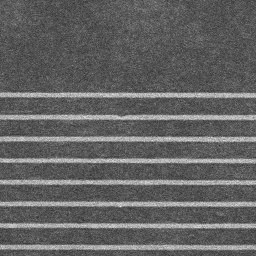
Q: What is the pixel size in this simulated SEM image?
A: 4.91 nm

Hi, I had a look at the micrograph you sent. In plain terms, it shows parallel lines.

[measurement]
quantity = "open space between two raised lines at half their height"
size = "85.9 nm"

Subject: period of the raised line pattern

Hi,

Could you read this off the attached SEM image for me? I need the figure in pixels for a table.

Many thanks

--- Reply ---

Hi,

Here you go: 21.7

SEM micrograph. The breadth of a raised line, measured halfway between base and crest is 0.019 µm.